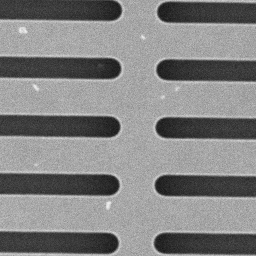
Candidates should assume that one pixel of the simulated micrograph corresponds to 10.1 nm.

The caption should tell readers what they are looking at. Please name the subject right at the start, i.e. groups of lines, slits or small figures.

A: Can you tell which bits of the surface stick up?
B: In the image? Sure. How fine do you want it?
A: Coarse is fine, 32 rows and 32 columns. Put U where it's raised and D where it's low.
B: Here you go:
DDDDDDDDDDDDDDDUUUUUDDDDDDDDDDDD
DDDDDDDDDDDDDDDUUUUUDDDDDDDDDDDD
DDDDDDDDDDDDDDDUUUUUDDDDDDDDDDDD
UUUUUUUUUUUUUUUUUUUUUUUUUUUUUUUU
UUUUUUUUUUUUUUUUUUUUUUUUUUUUUUUU
UUUUUUUUUUUUUUUUUUUUUUUUUUUUUUUU
UUUUUUUUUUUUUUUUUUUUUUUUUUUUUUUU
DDDDDDDDDDDDDDDUUUUUUDDDDDDDDDDD
DDDDDDDDDDDDDDDUUUUUDDDDDDDDDDDD
DDDDDDDDDDDDDDDUUUUUDDDDDDDDDDDD
UUUUUUUUUUUUUUUUUUUUUUUUUUUUUUUU
UUUUUUUUUUUUUUUUUUUUUUUUUUUUUUUU
UUUUUUUUUUUUUUUUUUUUUUUUUUUUUUUU
UUUUUUUUUUUUUUUUUUUUUUUUUUUUUUUU
DDDDDDDDDDDDDUUUUUUUUUUUUUUUUUUU
DDDDDDDDDDDDDDDUUUUUDDDDDDDDDDDD
DDDDDDDDDDDDDDDUUUUUDDDDDDDDDDDD
UUUUUUUUUUUUUUUUUUUUUUUUUUUUUUUU
UUUUUUUUUUUUUUUUUUUUUUUUUUUUUUUU
UUUUUUUUUUUUUUUUUUUUUUUUUUUUUUUU
UUUUUUUUUUUUUUUUUUUUUUUUUUUUUUUU
UUUUUUUUUUUUUUUUUUUUUUUUUUUUUUUU
DDDDDDDDDDDDDDDUUUUUDDDDDDDDDDDD
DDDDDDDDDDDDDDDUUUUDDDDDDDDDDDDD
UUUUUUUUUUUDDUUUUUUUUDDDDDDDDDDD
UUUUUUUUUUUUUUUUUUUUUUUUUUUUUUUU
UUUUUUUUUUUUUUUUUUUUUUUUUUUUUUUU
UUUUUUUUUUUUUUUUUUUUUUUUUUUUUUUU
UUUUUUUUUUUUUUUUUUUUUUUUUUUUUUUU
DDDDDDDDDDDDDDUUUUUUDDDDDDDDDDDD
DDDDDDDDDDDDDDDUUUUDDDDDDDDDDDDD
DDDDDDDDDDDDDDUUUUUUDDDDDDDDDDDD